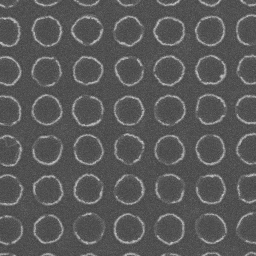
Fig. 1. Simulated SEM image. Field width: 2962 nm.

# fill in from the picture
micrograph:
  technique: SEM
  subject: a regular array of raised bodies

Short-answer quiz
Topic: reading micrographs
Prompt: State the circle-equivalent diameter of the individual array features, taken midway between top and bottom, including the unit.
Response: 352 nm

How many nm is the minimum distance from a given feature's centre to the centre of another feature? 454